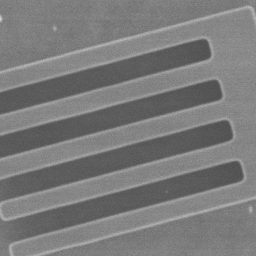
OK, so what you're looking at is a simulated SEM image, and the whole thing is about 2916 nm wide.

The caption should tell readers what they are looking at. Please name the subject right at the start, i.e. groups of lines, slits or small figures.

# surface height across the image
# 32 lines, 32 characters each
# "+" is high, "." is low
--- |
................................
............................++++
.........................+++++++
....................++++++++++++
.................+++++++++++++++
.............+++++++++....++++++
.........++++++++++.......++++++
......+++++++++...........++++++
..+++++++++...........++++++++++
+++++++...........++++++++++++++
++++...........+++++++++...+++++
...........++++++++++.......++++
.......++++++++++..........+++++
...++++++++++...........++++++++
+++++++++...........++++++++++++
+++++...........++++++++++...+++
++...........+++++++++.......+++
.........+++++++++...........+++
.....++++++++++...........++++++
.++++++++++...........++++++++++
+++++++...........+++++++++...++
+++...........++++++++++......++
...........+++++++++..........++
.......+++++++++...........+++++
...+++++++++...........+++++++++
+++++++++...........+++++++++...
+++++...........++++++++++......
............++++++++++..........
.........+++++++++..............
.....+++++++++..................
.+++++++++......................
.+++++..........................